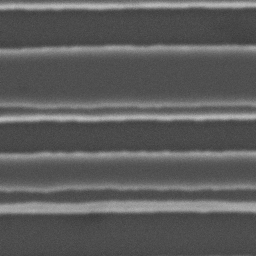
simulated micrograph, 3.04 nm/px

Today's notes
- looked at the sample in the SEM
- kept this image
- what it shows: lines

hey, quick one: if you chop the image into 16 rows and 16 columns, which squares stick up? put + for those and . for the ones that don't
++++..+.........
................
................
++++++++++++++++
++++++++++++++++
++++++++++++++++
++++++++++++++++
+++++++.........
................
................
++++++++++++++++
++++++++++++++++
++++++++++++++++
................
................
................